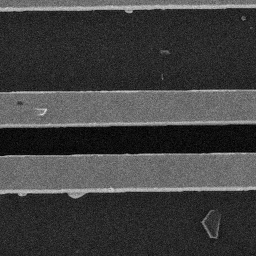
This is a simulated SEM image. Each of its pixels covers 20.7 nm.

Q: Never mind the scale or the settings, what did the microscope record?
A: lines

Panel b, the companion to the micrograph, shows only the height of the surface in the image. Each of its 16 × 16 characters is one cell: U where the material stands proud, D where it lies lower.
UUUUUUUUUUUUUDDD
DDDDDDDDDDDDDDDD
DDDDDDDDDDDDDDDD
DDDDDDDDDDDDDDDD
DDDDDDDDDDDDDDDD
DDDDDDDDDDDDDDDD
UUUUUUUUUUUUUUUU
UUUUUUUUUUUUUUUU
DDDDDDDDDDDDDDDD
DDDDDDDDDDDDDDDD
UUUUUUUUUUUUUUUU
UUUUUUUUUUUUUUUU
DDDDDDDDDDDDDDDD
DDDDDDDDDDDDDDDD
DDDDDDDDDDDDDDDD
DDDDDDDDDDDDDDDD